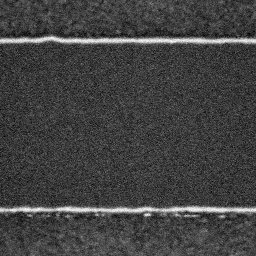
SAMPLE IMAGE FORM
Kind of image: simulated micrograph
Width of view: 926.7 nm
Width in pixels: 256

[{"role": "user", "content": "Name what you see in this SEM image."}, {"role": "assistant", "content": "one or a few lines or trenches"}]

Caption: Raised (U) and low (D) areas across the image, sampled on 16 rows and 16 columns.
DDDDDDDDDDDDDDDD
DDDDDDDDDDDDDDDD
DDUUDDDDDDDDDDDD
UUUUUUUUUUUUUUUU
UUUUUUUUUUUUUUUU
UUUUUUUUUUUUUUUU
UUUUUUUUUUUUUUUU
UUUUUUUUUUUUUUUU
UUUUUUUUUUUUUUUU
UUUUUUUUUUUUUUUU
UUUUUUUUUUUUUUUU
UUUUUUUUUUUUUUUU
UUUUUUUUUUUUUUUU
DDDDDDDDDDDDDDDD
DDDDDDDDDDDDDDDD
DDDDDDDDDDDDDDDD